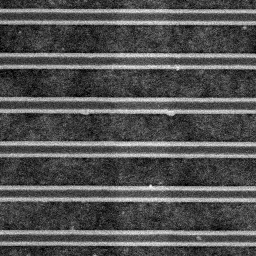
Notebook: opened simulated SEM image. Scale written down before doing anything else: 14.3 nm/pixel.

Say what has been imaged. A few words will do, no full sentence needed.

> parallel lines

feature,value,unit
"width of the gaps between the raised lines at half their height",443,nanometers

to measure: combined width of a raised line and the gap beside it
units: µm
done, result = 0.635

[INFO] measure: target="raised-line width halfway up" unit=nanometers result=194